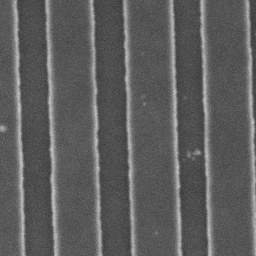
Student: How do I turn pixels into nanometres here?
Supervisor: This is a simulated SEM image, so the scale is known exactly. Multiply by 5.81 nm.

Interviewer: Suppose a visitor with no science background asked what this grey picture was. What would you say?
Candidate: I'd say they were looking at lines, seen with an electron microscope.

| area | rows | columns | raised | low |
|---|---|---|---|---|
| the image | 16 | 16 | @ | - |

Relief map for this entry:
@--@@@--@@@--@@@
@--@@@--@@@--@@@
@--@@@--@@@--@@@
@--@@@--@@@--@@@
@--@@@--@@@--@@@
@--@@@--@@@--@@@
@--@@@--@@@--@@@
@--@@@--@@@--@@@
@--@@@--@@@--@@@
@--@@@--@@@--@@@
@--@@@--@@@--@@@
@--@@@--@@@--@@@
@--@@@--@@@--@@@
@--@@@--@@@--@@@
@--@@@--@@@--@@@
@@-@@@--@@@--@@@